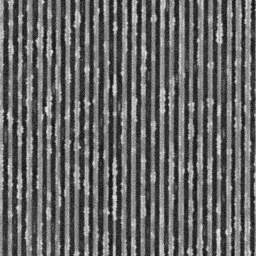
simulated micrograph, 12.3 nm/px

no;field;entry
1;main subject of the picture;parallel lines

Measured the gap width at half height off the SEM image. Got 5.25 px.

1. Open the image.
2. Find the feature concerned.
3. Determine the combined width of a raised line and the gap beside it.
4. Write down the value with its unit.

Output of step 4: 116 nm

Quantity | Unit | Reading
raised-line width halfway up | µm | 0.0522